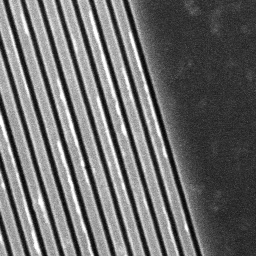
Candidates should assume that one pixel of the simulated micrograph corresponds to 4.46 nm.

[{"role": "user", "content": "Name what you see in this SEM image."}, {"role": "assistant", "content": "parallel lines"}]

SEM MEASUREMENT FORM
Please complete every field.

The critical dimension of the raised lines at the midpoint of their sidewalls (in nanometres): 46.7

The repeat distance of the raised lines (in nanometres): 73.5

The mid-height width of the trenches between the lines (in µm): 0.0252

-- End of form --